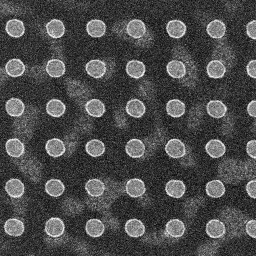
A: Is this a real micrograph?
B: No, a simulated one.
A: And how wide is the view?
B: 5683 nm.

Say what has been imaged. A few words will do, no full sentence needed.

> a regular array of raised bodies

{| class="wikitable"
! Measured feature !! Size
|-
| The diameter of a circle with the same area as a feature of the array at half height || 392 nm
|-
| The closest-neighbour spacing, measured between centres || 876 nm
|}